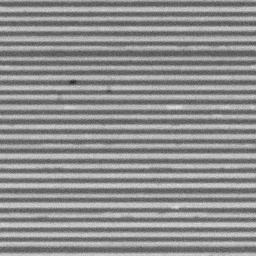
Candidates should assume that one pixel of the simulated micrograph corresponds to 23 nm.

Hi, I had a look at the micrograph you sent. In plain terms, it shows parallel lines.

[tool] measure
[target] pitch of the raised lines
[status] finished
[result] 226 nanometers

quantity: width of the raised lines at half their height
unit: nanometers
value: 77.8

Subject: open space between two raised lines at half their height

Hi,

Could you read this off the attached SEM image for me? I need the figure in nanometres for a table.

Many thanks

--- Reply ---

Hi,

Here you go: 156